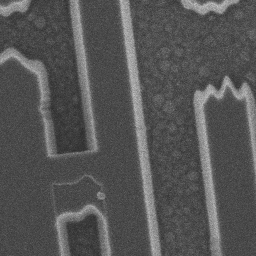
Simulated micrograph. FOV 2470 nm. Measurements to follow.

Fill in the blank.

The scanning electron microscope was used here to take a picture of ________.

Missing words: one or a few lines or trenches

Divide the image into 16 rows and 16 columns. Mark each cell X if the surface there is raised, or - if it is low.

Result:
X----XXX----X---
-----XXX--------
-----XXX--------
X----XXX--------
XXX--XXX--------
XXX--XXX------X-
XXX--XXXX---XXXX
XXX---XXX---XXXX
XXX---XXX----XXX
XXXX-XXXX----XXX
XXXXXXXXX----XXX
XXXXXXXXX----XXX
XXXXXXXXX----XXX
XXXXX-XXXX---XXX
XXXX--XXXX---XXX
XXXX---XXX---XXX